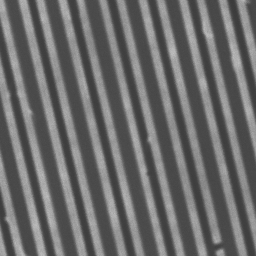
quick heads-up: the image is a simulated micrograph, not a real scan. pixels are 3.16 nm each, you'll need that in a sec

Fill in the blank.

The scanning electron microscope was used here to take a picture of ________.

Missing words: parallel lines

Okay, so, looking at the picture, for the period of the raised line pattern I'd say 61.6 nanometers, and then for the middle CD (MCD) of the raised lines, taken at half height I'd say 0.027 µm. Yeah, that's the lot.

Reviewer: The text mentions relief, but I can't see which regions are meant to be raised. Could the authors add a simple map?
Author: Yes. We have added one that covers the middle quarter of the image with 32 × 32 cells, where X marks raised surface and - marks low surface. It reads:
---XX--XX----XX--XX----XX--XX---
---XX--XX----XX--XX----XX--XX---
---XX--XX----XX--XXX---XX--XXX--
---XX--XXX---XX---XX---XX---XX--
----XX--XX----XX--XX---XXX--XX--
----XX--XX----XX--XX----XX--XX--
----XX--XX----XX--XX----XX--XX--
X---XX--XX----XX---XX---XX---XX-
X---XXX--XX---XXX--XX---XXX--XX-
X----XX--XX----XX--XX----XX--XX-
X----XX--XX----XX--XX----XX--XX-
X----XX--XX----XX---XX---XX---XX
XX---XXX--XX---XXX--XX---XX---XX
XX----XX--XX----XX--XX----XX--XX
XX----XX--XX----XX--XX----XX--XX
XX----XX--XX----XX--XXX---XX--XX
-XX---XX---XX---XX---XX---XX---X
-XX----XX--XX----XX--XX----XX--X
-XX----XX--XX----XX--XX----XX--X
-XX----XX--XX----XX--XXX---XX--X
-XXX---XX---XX---XX---XX---XX---
--XX----XX--XX----XX--XX---XXX--
--XX----XX--XX----XX--XX----XX--
--XX----XX--XX----XX--XX----XX--
--XXX---XX---X----XX---XX---XX--
---XX---XXX--XX---XXX--XX---XXX-
X--XX----XX--XX----XX--XX----XX-
X--XX----XX--XX----XX--XX----XX-
X--XX----XX---X----XX---XX---XX-
X---XX---XXX--XX---XXX--XX---XXX
XX--XX----XX--XX----XX--XX----XX
XX--XX----XX--XX----XX--XX----XX